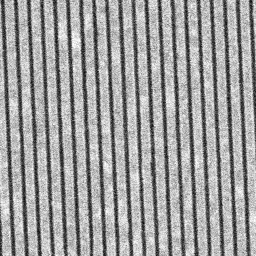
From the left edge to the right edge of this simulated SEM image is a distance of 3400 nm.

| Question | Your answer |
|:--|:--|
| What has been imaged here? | parallel lines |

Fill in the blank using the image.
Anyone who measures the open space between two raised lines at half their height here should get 63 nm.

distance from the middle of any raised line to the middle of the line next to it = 173 nanometres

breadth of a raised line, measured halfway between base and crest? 113 nm